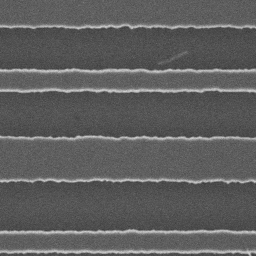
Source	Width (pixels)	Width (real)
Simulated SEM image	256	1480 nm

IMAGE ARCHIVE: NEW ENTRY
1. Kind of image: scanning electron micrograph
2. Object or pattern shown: lines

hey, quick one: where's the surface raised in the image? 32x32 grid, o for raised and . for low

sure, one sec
oooooooooooooooooooooooooooooooo
oooooooooooooooooooooooooooooooo
oooooooooooooooooooooooooooooooo
.........o...........o..........
................................
................................
................................
................................
................................
oooooooooooooooooooooooooooooooo
oooooooooooooooooooooooooooooooo
..oo....o......o................
................................
................................
................................
................................
................................
oooooooooooooooooooooooooooooooo
oooooooooooooooooooooooooooooooo
oooooooooooooooooooooooooooooooo
oooooooooooooooooooooooooooooooo
oooooooooooooooooooooooooooooooo
oooooooooooooooooooooooooooooooo
................................
................................
................................
................................
................................
................................
oooooooooooooooooooooooooooooooo
oooooooooooooooooooooooooooooooo
oooooooooooooooooooooooooooooooo